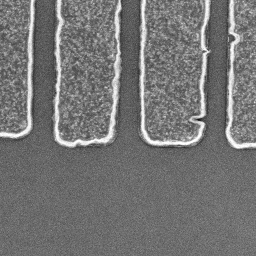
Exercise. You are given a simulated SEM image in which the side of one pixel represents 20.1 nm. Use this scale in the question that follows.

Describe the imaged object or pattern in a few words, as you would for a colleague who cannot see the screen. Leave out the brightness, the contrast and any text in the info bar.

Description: one or a few lines or trenches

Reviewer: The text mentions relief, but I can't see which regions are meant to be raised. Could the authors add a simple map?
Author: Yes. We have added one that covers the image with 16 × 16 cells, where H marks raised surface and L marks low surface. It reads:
HHLLHHHLLHHHHLHH
HHLLHHHLLHHHHLLH
HHLLHHHLLHHHHLLH
HHLLHHHLLHHHHLLH
HHLLHHHLLHHHHLHH
HHLLHHHLLHHHHLHH
HHLLHHHLLHHHHLHH
HHLLHHHLLHHHLLHH
LLLLHHHLLHHHLLHH
LLLLLLLLLLLLLLLL
LLLLLLLLLLLLLLLL
LLLLLLLLLLLLLLLL
LLLLLLLLLLLLLLLL
LLLLLLLLLLLLLLLL
LLLLLLLLLLLLLLLL
LLLLLLLLLLLLLLLL